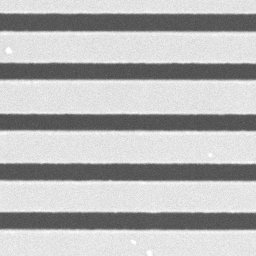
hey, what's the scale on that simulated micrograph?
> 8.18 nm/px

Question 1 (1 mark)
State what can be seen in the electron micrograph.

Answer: lines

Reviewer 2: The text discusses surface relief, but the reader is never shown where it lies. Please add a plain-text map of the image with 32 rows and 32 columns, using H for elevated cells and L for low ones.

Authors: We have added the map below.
HHHHHHHHHHHHHHHHHHHHHHHHHHHHHHHH
HHHHHHHHHHHHHHHHHHHHHHHHHHHHHHHH
LLLLLLLLLLLLLLLLLLLLLLLLLLLLLLLL
LLLLLLLLLLLLLLLLLLLLLLLLLLLLLLLL
HHHHHHHHHHHHHHHHHHHHHHHHHHHHHHHH
HHHHHHHHHHHHHHHHHHHHHHHHHHHHHHHH
HHHHHHHHHHHHHHHHHHHHHHHHHHHHHHHH
HHHHHHHHHHHHHHHHHHHHHHHHHHHHHHHH
LLLLLLLLLLLLLLLLLLLLLLLLLLLLLLLL
LLLLLLLLLLLLLLLLLLLLLLLLLLLLLLLL
HHHHHHHHHHHHHHHHHHHHHHHHHHHHHHHH
HHHHHHHHHHHHHHHHHHHHHHHHHHHHHHHH
HHHHHHHHHHHHHHHHHHHHHHHHHHHHHHHH
HHHHHHHHHHHHHHHHHHHHHHHHHHHHHHHH
LLLLLLLLLLLLLLLLLLLLLLLLLLLLLLLL
LLLLLLLLLLLLLLLLLLLLLLLLLLLLLLLL
HHHHHHHHHHHHHHHHHHHHHHHHHHHHHHHH
HHHHHHHHHHHHHHHHHHHHHHHHHHHHHHHH
HHHHHHHHHHHHHHHHHHHHHHHHHHHHHHHH
HHHHHHHHHHHHHHHHHHHHHHHHHHHHHHHH
LLLLLLLLLLLLLLLLLLLLLLLLLLLLLLLL
LLLLLLLLLLLLLLLLLLLLLLLLLLLLLLLL
LLLLLLLLLLLLLLLLLLLLLLLLLLLLLLLL
HHHHHHHHHHHHHHHHHHHHHHHHHHHHHHHH
HHHHHHHHHHHHHHHHHHHHHHHHHHHHHHHH
HHHHHHHHHHHHHHHHHHHHHHHHHHHHHHHH
HHHHHHHHHHHHHHHHHHHHHHHHHHHHHHHH
LLLLLLLLLLLLLLLLLLLLLLLLLLLLLLLL
LLLLLLLLLLLLLLLLLLLLLLLLLLLLLLLL
HHHHHHHHHHHHHHHHHHHHHHHHHHHHHHHH
HHHHHHHHHHHHHHHHHHHHHHHHHHHHHHHH
HHHHHHHHHHHHHHHHHHHHHHHHHHHHHHHH